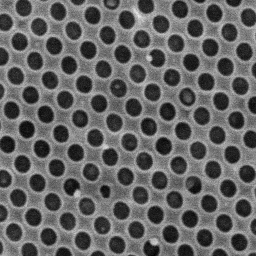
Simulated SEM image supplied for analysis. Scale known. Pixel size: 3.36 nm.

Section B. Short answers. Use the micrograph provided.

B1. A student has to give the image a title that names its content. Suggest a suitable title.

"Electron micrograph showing a regular array of holes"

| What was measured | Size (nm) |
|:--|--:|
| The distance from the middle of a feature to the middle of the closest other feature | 81.4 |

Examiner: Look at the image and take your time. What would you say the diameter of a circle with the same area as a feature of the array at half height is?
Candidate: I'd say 60.3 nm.